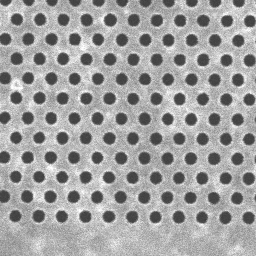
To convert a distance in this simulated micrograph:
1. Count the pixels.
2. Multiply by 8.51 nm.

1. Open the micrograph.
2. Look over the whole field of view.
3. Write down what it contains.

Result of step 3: a regular array of holes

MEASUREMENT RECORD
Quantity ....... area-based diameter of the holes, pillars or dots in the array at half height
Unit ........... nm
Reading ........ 112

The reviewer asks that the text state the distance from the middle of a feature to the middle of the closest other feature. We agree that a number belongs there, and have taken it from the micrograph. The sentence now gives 0.193 microns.